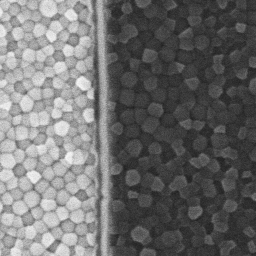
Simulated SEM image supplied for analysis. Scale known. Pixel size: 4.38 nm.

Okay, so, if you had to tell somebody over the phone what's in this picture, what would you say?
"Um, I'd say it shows one or a few lines or trenches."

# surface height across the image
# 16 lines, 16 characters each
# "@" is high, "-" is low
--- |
------@@@@@@@@@@
------@@@@@@@@@@
------@@@@@@@@@@
------@@@@@@@@@@
------@@@@@@@@@@
------@@@@@@@@@@
------@@@@@@@@@@
------@@@@@@@@@@
------@@@@@@@@@@
------@@@@@@@@@@
------@@@@@@@@@@
-------@@@@@@@@@
-------@@@@@@@@@
------@@@@@@@@@@
------@@@@@@@@@@
------@@@@@@@@@@